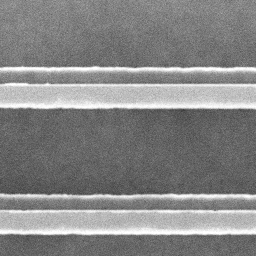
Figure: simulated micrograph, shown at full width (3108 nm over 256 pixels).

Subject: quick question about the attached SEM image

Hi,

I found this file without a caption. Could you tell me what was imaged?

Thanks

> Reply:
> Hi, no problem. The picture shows lines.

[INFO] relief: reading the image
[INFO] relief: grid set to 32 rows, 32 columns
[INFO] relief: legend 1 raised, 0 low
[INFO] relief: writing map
00000000000000000000000000000000
00000000000000000000000000000000
00000000000000000000000000000000
00000000000000000000000000000000
00000000000000000000000000000000
00000000000000000000000000000000
00000000000000000000000000000000
00000000000000000000000000000000
00100000000110000000000000000000
11111111111111111111111111111111
11111111111111111111111111111111
11111111111111111111111111111111
11111111111111111111111111111111
00000000000000000000000000000000
00000000000000000000000000000000
00000000000000000000000000000000
00000000000000000000000000000000
00000000000000000000000000000000
00000000000000000000000000000000
00000000000000000000000000000000
00000000000000000000000000000000
00000000000000000000000000000000
00000000000000000000000000000000
00000000000000000000000000000000
11111111111111111111111111111111
11111111111111111111111111111111
11111111111111111111111111111111
11111111111111111111111111111111
11111111111111111111111111111111
00000000000000000000000000000000
00000000000000000000000000000000
00000000000000000000000000000000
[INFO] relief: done